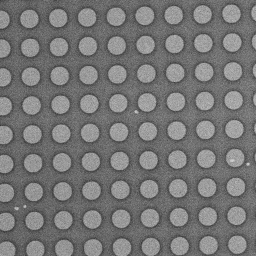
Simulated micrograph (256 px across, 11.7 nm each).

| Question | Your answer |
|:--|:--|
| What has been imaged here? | an array of small figures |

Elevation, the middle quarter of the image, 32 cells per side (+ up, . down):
.............+......++....+++...
+...++++...++++....++++...++++..
+...++++...++++...+++++...++++..
+...++++...++++....+++....++++..
+....++.....+++.....+...........
................................
................................
....................+......++...
+....+++....+++....++++...++++..
+...++++...+++++...++++...++++..
+...++++...+++++...++++...++++..
+....+++....+++.....++.....++...
................................
................................
................................
.....+++....+++....++++...++++..
+...+++++...++++...++++...++++..
+...+++++...++++...++++...++++..
+....+++....+++....+++.....++...
................................
................................
................................
......++.....++.....+++....+++..
+....++++...++++...++++...++++..
++...++++...++++...++++...++++..
++...++++...++++...++++....+++..
+.....++........................
................................
................................
.............++.....+++....+++..
+....++++...++++...++++...+++++.
++...++++...++++...++++...+++++.